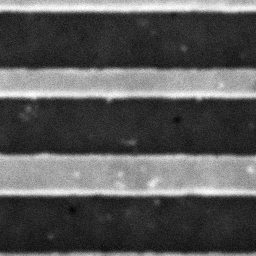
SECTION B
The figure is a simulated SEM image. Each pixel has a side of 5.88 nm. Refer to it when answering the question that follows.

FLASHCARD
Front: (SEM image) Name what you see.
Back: lines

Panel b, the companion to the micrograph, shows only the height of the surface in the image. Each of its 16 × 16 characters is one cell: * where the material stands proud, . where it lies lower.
**********.*.***
................
................
................
****************
****************
................
................
................
................
****************
****************
................
................
................
................